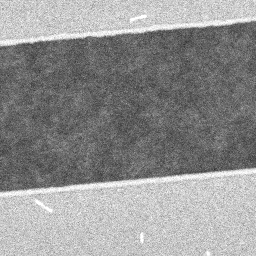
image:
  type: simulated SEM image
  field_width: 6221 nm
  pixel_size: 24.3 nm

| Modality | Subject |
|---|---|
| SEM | one or a few lines or trenches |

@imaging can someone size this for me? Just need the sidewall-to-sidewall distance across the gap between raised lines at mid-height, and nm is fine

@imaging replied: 3680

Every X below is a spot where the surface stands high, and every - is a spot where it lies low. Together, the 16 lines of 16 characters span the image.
XXXXXXXXXXXXXXXX
XXXXXXXXXXXXX---
XX--------------
----------------
----------------
----------------
----------------
----------------
----------------
----------------
----------------
-------XXXXXXXXX
XXXXXXXXXXXXXXXX
XXXXXXXXXXXXXXXX
XXXXXXXXXXXXXXXX
XXXXXXXXXXXXXXXX